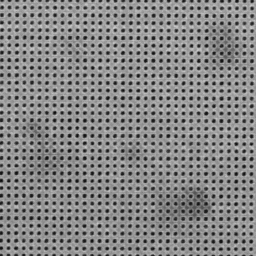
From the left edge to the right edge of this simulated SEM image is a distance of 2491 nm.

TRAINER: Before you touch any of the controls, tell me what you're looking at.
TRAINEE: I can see a regular array of holes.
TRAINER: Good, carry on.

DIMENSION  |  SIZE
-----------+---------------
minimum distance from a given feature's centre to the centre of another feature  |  69.8 nanometers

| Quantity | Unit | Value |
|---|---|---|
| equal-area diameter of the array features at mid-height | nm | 46.6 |